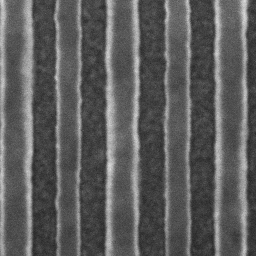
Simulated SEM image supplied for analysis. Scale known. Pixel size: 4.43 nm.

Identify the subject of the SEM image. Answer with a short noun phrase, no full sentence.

lines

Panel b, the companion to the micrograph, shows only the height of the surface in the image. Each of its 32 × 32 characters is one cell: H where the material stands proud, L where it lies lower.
HHHHLLLHHHLLLHHHHLLLLHHHLLLHHHHL
HHHHLLLHHHLLLHHHHLLLLHHHLLLHHHHL
HHHHLLLHHHLLLLHHHLLLLHHHLLLHHHHL
HHHHLLLHHHLLLHHHHLLLLHHHLLLHHHHL
HHHHLLLHHHLLLHHHHLLLLHHHLLLHHHHL
HHHHLLLHHHLLLHHHHLLLLHHHLLLHHHHL
HHHHLLLHHHLLLHHHHLLLLHHHLLLHHHHL
HHHHLLLHHHLLLHHHHLLLLHHHLLLHHHHL
HHHHLLLHHHLLLHHHHLLLLHHHLLLHHHHL
HHHHLLLHHHLLLHHHHLLLLHHHLLLHHHHL
HHHHLLLHHHLLLLHHHLLLLHHHLLLHHHHL
HHHHLLLHHHLLLHHHHLLLLHHHLLLHHHHL
HHHHLLLHHHLLLHHHHLLLLHHHLLLHHHHL
HHHHLLLHHHLLLHHHHLLLLHHHLLLHHHHL
HHHHLLLHHHLLLHHHHLLLLHHHLLLHHHHL
HHHHLLLHHHLLLHHHHLLLLHHHLLLHHHHL
HHHHLLLHHHLLLLHHHLLLLHHHLLLHHHHL
HHHHLLLHHHLLLLHHHLLLLHHHLLLHHHHL
HHHHLLLHHHLLLLHHHLLLLHHHLLLHHHHL
HHHHLLLHHHLLLHHHHLLLLHHHLLLHHHHL
HHHHLLLHHHLLLHHHHLLLLHHHLLLHHHHL
HHHHLLLHHHLLLLHHHLLLLHHHLLLHHHHL
HHHHLLLHHHLLLHHHHLLLLHHHLLLHHHHL
HHHHLLLHHHLLLHHHHLLLLHHHLLLHHHHL
HHHHLLLHHHLLLHHHHLLLLHHHLLLHHHHL
HHHHLLLHHHLLLHHHHLLLLHHHLLLHHHHL
HHHHLLLHHHLLLHHHHLLLLHHHLLLHHHHL
HHHHLLLHHHLLLHHHHLLLLHHHLLLHHHHL
HHHHLLLHHHLLLHHHHLLLLHHHLLLHHHHL
HHHHLLLHHHLLLHHHHLLLLHHHLLLHHHHL
HHHHLLLHHHLLLHHHHLLLLHHHLLLHHHHL
HHHHLLLHHHLLLHHHHLLLLHHHLLLHHHHL